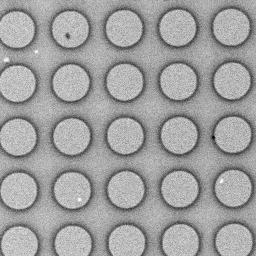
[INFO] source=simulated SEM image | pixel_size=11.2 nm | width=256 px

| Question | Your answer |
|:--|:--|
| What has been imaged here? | an array of small figures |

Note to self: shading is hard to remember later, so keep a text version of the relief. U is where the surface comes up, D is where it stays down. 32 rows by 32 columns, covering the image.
DDDDDDDDDDDDDDDDDDDDDDDDDDDDDDDD
DDDDDDDDUDDDDDDUDDDDDUUDDDDDUUDD
UUUUDDDUUUUDDDUUUDDDUUUUDDDUUUUD
UUUUDDDUUUUDDUUUUUDDUUUUDDDUUUUD
UUUUDDDUUUUDDUUUUUDDUUUUDDDUUUUD
DUUDDDDDUUDDDDUUUDDDDUUDDDDDUUDD
DDDDDDDDDDDDDDDDDDDDDDDDDDDDDDDD
DDDDDDDDDDDDDDDDDDDDDDDDDDDDDDDD
DUUDDDDDUUDDDDUUUDDDDUUUDDDDUUUD
UUUUDDDUUUUDDDUUUUDDUUUUDDDUUUUD
UUUUDDDUUUUDDUUUUUDDUUUUDDDUUUUD
UUUUDDDUUUUDDDUUUDDDDUUUDDDUUUUD
DUUDDDDDUDDDDDDDDDDDDDDDDDDDDDDD
DDDDDDDDDDDDDDDDDDDDDDDDDDDDDDDD
DDDDDDDDDDDDDDDDDDDDDDDDDDDDDDDD
DUUUDDDUUUUDDDUUUDDDDUUUDDDUUUUD
UUUUDDDUUUUDDDUUUUDDUUUUUDDUUUUD
UUUUDDDUUUUDDDUUUUDDUUUUUDDUUUUD
UUUUDDDUUUUDDDUUUDDDDUUUDDDDUUUD
DDDDDDDDDDDDDDDDDDDDDDDDDDDDDDDD
DDDDDDDDDDDDDDDDDDDDDDDDDDDDDDDD
DDDDDDDDDDDDDDDUDDDDDDUDDDDDUUDD
DUUUDDDUUUUDDDUUUUDDDUUUDDDUUUUD
UUUUUDDUUUUDDDUUUUDDUUUUUDDUUUUD
UUUUDDDUUUUDDDUUUUDDUUUUUDDUUUUD
DUUUDDDDUUDDDDUUUDDDDUUUDDDDUUDD
DDDDDDDDDDDDDDDDDDDDDDDDDDDDDDDD
DDDDDDDDDDDDDDDDDDDDDDDDDDDDDDDD
DDUDDDDDUUDDDDDUUDDDDUUUDDDDUUUD
UUUUDDDUUUUDDDUUUUDDUUUUUDDUUUUD
UUUUUDDUUUUDDDUUUUDDUUUUUDDUUUUD
UUUUDDDUUUUDDDUUUUDDDUUUUDDUUUUD